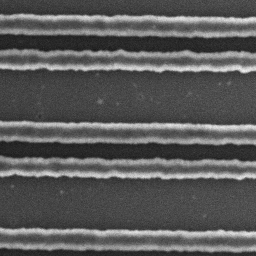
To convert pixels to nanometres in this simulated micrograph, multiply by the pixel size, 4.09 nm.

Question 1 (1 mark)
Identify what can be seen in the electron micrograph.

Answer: lines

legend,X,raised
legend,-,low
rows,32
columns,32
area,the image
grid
--------------------------------
--------------------------------
XXXXXXXXXXXXXXXXXXXXXXXXXXXXXXXX
XXXXXXXXXXXXXXXXXXXXXXXXXXXXXXXX
-----------------------X-XXX----
--------------------------------
XXXXX-XXX-XXX-XX-------X--------
XXXXXXXXXXXXXXXXXXXXXXXXXXXXXXXX
-XXXX-XXXXXXXXXXXXXXXXXXXXXXXXXX
--------------------------------
--------------------------------
--------------------------------
--------------------------------
--------------------------------
--------------------------------
XXXXX---------------------------
XXXXXXXXXXXXXXXXXXXXXXXXXXXXXXXX
X--XXXXXXXXXXXXXXXXXXXXXXXXXXXXX
--------------------------------
--------------------------------
XXXXXXXXXXXXXXXXXXXXXXXXXXXXXXXX
XXXXXXXXXXXXXXXXXXXXXXXXXXXXXXXX
--------------------------------
--------------------------------
--------------------------------
--------------------------------
--------------------------------
--------------------------------
--------------------------------
XXXXXXXXXXXXXXXXXXXXXXXXXXXXXXXX
XXXXXXXXXXXXXXXXXXXXXXXXXXXXXXXX
--------------------------------